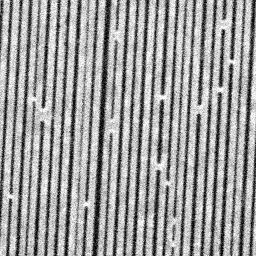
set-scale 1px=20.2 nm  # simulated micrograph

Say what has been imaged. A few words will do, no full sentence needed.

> parallel lines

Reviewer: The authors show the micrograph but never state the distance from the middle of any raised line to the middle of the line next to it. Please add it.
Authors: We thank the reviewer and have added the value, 196 nanometres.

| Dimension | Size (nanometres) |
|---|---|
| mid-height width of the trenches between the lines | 90.7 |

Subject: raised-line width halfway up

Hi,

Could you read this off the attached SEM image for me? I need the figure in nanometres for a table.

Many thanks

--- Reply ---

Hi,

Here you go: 108